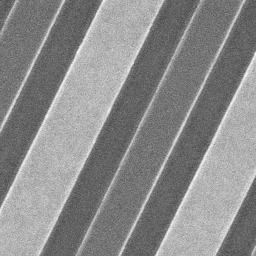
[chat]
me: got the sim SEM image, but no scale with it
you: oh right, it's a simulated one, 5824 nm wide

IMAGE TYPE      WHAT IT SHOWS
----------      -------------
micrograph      lines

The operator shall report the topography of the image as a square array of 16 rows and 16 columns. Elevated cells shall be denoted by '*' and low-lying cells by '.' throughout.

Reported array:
.***..****..***.
***...***...***.
***..****..***..
**...****..***..
**..****..***..*
*...****..***..*
*..****..***..**
...****..***..**
..****..***..***
..****..***..***
.****..***..****
.****..***..****
****..***..****.
****..***..****.
***..***..****..
***..***..****..